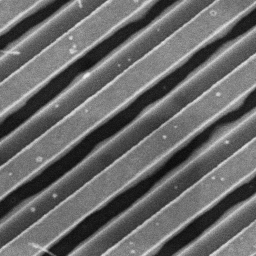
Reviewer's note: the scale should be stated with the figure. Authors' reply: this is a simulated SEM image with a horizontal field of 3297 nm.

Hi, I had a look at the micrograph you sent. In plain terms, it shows lines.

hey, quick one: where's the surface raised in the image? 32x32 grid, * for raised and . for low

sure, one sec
*****....*********....**********
***....**********....**********.
**....**********....*********...
*....**********....*********....
....*********....**********....*
..**********....*********....***
.*********.....*********....****
*********....**********....*****
********....**********...*******
*******...**********....********
*****....**********....*********
****....**********....*********.
***....*********....**********..
*.....*********....**********...
....**********....*********....*
...*********....**********....**
..*********....**********...****
**********....*********....*****
*********...**********....******
*******....**********....*******
******....*********....*********
*****....*********....**********
***....**********....**********.
**....*********....**********...
*....*********....**********....
...**********....**********....*
..**********....*********....***
.*********....**********....****
*********....**********....*****
********....*********....*******
******....**********....********
*****....**********....*********